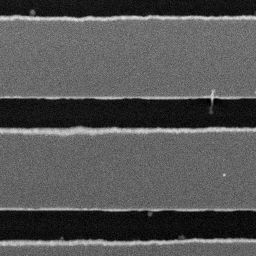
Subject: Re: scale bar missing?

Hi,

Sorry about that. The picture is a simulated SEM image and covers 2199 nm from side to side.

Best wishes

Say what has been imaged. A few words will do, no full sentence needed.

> lines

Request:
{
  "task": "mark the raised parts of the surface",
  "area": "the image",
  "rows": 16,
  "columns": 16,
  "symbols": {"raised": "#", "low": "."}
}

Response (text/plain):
................
################
################
################
################
################
................
................
################
################
################
################
################
................
................
################